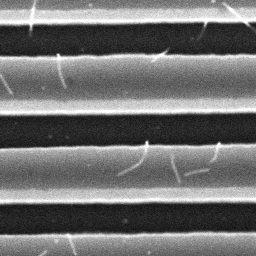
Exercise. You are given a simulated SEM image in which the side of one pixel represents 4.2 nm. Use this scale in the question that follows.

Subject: lines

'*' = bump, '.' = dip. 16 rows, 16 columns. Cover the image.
****************
................
................
..........*.....
****************
****************
****************
................
................
****************
****************
****************
*************...
................
................
****************